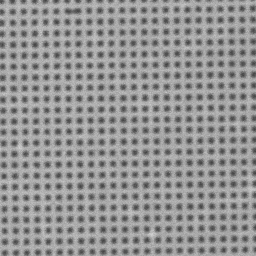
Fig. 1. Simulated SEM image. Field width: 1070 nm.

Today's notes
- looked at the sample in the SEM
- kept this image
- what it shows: a regular array of holes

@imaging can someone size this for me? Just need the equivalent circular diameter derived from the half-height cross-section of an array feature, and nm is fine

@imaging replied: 28.7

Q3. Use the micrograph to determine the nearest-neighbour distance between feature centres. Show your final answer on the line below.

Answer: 43.7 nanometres